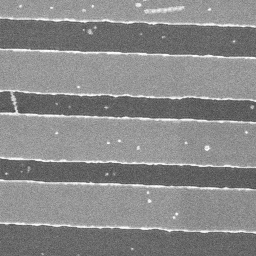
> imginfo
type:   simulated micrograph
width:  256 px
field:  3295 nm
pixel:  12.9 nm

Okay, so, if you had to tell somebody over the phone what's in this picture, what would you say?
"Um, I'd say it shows lines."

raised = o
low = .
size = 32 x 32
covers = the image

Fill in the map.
oooooooooooooooooooooooooooooooo
oooooooooooooooooooooooooooooooo
......oooooooooooooooooooooooooo
................................
................................
................................
oooooooooo......................
oooooooooooooooooooooooooooooooo
oooooooooooooooooooooooooooooooo
oooooooooooooooooooooooooooooooo
oooooooooooooooooooooooooooooooo
...ooooooooooooooooooooooooooooo
...............................o
................................
oooooooo........................
oooooooooooooooooooooooooooooooo
oooooooooooooooooooooooooooooooo
oooooooooooooooooooooooooooooooo
oooooooooooooooooooooooooooooooo
oooooooooooooooooooooooooooooooo
..................oooooooooooooo
................................
................................
ooooooooooooooooooooooooo.......
oooooooooooooooooooooooooooooooo
oooooooooooooooooooooooooooooooo
oooooooooooooooooooooooooooooooo
oooooooooooooooooooooooooooooooo
.................ooooooooooooooo
................................
................................
................................